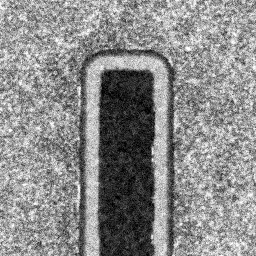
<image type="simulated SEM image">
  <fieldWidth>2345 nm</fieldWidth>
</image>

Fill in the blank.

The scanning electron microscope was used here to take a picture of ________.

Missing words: one or a few lines or trenches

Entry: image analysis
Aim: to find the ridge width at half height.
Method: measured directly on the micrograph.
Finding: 638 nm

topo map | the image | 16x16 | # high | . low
................
................
................
................
......####......
......####......
......####......
......####......
......####......
......####......
......####......
......####......
......####......
......####......
......####......
......####......